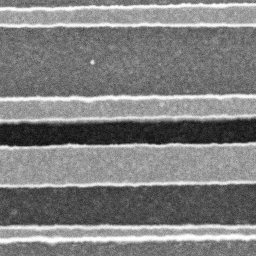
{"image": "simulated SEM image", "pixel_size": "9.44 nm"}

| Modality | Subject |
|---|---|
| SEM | lines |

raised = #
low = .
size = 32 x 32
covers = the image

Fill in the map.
................................
################################
################################
................................
................................
................................
................................
................................
................................
................................
................................
................................
.###############################
################################
################################
................................
................................
................................
################################
################################
################################
################################
################################
................................
................................
................................
................................
................................
.###############################
################################
................................
................................